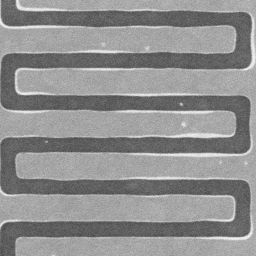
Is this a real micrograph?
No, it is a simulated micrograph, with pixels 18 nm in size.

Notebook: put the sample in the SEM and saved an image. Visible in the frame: groups of lines, slits or small figures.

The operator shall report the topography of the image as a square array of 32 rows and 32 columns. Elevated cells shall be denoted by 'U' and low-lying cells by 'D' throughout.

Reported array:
DDUUUUUUUUUUUUUUUUUUUUUUUUUUUUUU
DDDDDDDDDDDDDDDDDDDDDDDDDDDDDDDU
DDDDDDDDDDDDDDDDDDDDDDDDDDDDDDDD
UUUUUUUUUUUUUUUUUUUUUUUUUUUUUDDD
UUUUUUUUUUUUUUUUUUUUUUUUUUUUUDDD
UUUUUUUUUUUUUUUUUUUUUUUUUUUUUDDD
UUUUUUUUUUDDDDDUUUUUDUUUUUUUUDDD
DDDDDDDDDDDDDDDDDDDDDDDDDDDDDDDD
DDDDDDDDDDDDDDDDDDDDDDDDDDDDDDDU
DDUUUUUUUUUUUUUUUUUUUUUUUUUUUUUU
DDUUUUUUUUUUUUUUUUUUUUUUUUUUUUUU
DDUUUUUUUUUUUUUUUUUUUUUUUUUUUUUU
DDDDDDDDDDDDDDDDDDDDDDDDDDDDDDDU
UDDDDDDDDDDDDDDDDDDDDDDDDDDDDDDU
UUUUUUUUUUUUUUUUUUUUUUUUUUUUUDDU
UUUUUUUUUUUUUUUUUUUUUUUUUUUUUDDU
UUUUUUUUUUUUUUUUUUUUUUUUUUUUUDDU
DDDDDDDDDDDDDDDDDDDDDDDDDDDDDDDU
DDDDDDDDDDDDDDDDDDDDDDDDDDDDDDDU
DDUUUUUUUUUUUUUUUUUUUUUUDUUUUUUU
DDUUUUUUUUUUUUUUUUUUUUUUUUUUUUUU
DDUUUUUUUUUUUUUUUUUUUUUUUUUUUUUU
DDDDDDDDDDDDDDDDDDDDDDDDDDDDDDUU
DDDDDDDDDDDDDDDDDDDDDDDDDDDDDDDU
UUUUUUUUUUUUUUUUUDDDUUUUUDDDDDDU
UUUUUUUUUUUUUUUUUUUUUUUUUUUUUDDU
UUUUUUUUUUUUUUUUUUUUUUUUUUUUUDDU
UUUUUUUUUUUUUUUUUUUUUUUUUUUUUDDU
DDDDDDDDDDDDDDDDDDDDDDDDDDDDDDDU
DDDDDDDDDDDDDDDDDDDDDDDDDDDDDDDU
DDUUUUUUUUUUUUUUUUUUUUUUUUUUUUUU
DDUUUUUUUUUUUUUUUUUUUUUUUUUUUUUU